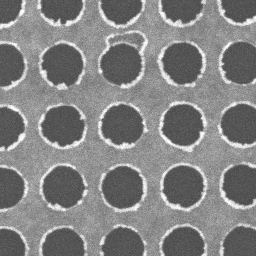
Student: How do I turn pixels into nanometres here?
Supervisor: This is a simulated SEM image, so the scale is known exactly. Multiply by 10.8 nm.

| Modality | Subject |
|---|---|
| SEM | a regular array of holes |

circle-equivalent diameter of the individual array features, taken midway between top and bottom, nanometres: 453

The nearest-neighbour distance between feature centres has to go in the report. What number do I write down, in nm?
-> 641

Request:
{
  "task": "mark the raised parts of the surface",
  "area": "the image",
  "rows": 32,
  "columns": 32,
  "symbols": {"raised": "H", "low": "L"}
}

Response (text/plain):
LLLHHLLLLLHHHLLLLLHHLLLLLHHHLLLL
LLLHHLLLLLHHHLLLLHHHLLLLLHHHLLLL
LLHHHHLLLHHHHHLLHHHHHLLLHHHHHLLH
HHHHHHHHHHHHHHHHHHHHHHHHHHHHHHHH
HHHHHHHHHHHHHHHHHHHHHHHHHHHHHHHH
LHHHHHHHHHHHHHHLHHHHHHLLHHHHHLLH
LLLHHHLLLLHHHLLLLHHHHLLLLHHHLLLL
LLLHHLLLLLHHHLLLLLHHLLLLLHHHLLLL
LLLHHLLLLLHHHLLLLLHHLLLLLHHHLLLL
LLLHHHLLLLHHHLLLLHHHHLLLLHHHLLLL
LHHHHHHLLHHHHHLLHHHHHHLLHHHHHHLH
HHHHHHHHHHHHHHHHHHHHHHHHHHHHHHHH
HHHHHHHHHHHHHHHHHHHHHHHHHHHHHHHH
LHHHHHLLLHHHHHLLLHHHHLLLHHHHHLLL
LLLHHHLLLLHHHLLLLLHHHLLLLHHHLLLL
LLLHHLLLLLLHHLLLLLHHLLLLLHHHLLLL
LLLHHLLLLLHHHLLLLLHHLLLLLHHHLLLL
LLHHHHLLLLHHHHLLLHHHHLLLLHHHHLLL
HHHHHHHHHHHHHHHHHHHHHHHHHHHHHHHH
HHHHHHHHHHHHHHHHHHHHHHHHHHHHHHHH
HHHHHHHHHHHHHHHHHHHHHHHHHHHHHHHH
LLHHHHLLLLHHHHLLLHHHHLLLLHHHLLLL
LLLHHLLLLLHHHLLLLLHHLLLLLHHHLLLL
LLLHHLLLLLLHHLLLLLHHLLLLLHHHLLLL
LLLHHHLLLLHHHLLLLLHHHLLLLHHHLLLL
LLHHHHLLLHHHHHLLLHHHHHLLHHHHHHLH
HHHHHHHHHHHHHHHHHHHHHHHHHHHHHHHH
HHHHHHHHHHHHHHHHHHHHHHHHHHHHHHHH
HHHHHHHHHHHHHHLLHHHHHHLLHHHHHLLL
LLLHHHLLLLHHHLLLLHHHHLLLLHHHLLLL
LLLHHLLLLLLHHLLLLLHHLLLLLLHHLLLL
LLLHHLLLLLLHHLLLLLHHLLLLLLHHLLLL